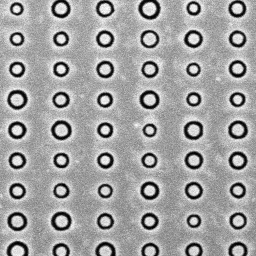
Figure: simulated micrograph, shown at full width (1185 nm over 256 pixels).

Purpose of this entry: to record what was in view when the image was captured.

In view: a regular array of ring-shaped grooves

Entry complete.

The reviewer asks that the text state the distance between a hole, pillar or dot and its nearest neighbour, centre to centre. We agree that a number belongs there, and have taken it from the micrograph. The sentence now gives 0.141 um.